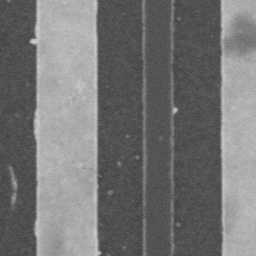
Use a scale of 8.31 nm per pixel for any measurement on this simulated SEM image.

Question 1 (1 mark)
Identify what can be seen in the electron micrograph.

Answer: lines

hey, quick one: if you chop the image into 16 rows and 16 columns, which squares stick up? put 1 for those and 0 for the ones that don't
0011110001100011
0011110001100011
0011110001100011
0011110001100011
0011110001100011
0011110001100011
0011110001100011
0011110001100011
0011110001100011
0011110001100011
0011110001100011
0011110001100011
0011110001100011
0011110001100011
0011110001100011
0011110001100011